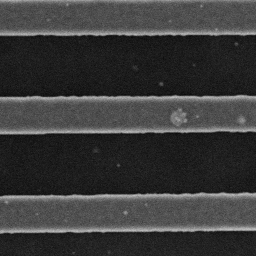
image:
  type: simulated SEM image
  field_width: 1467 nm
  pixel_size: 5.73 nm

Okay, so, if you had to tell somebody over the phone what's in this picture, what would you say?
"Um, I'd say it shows lines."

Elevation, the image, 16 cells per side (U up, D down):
UUUUUUUUUUUUUUUU
UUUUUUUUUUUUUUUU
DDDDDDDDDDDDDDDD
DDDDDDDDDDDDDDDD
DDDDDDDDDDDDDDDD
DDDDDDDDDDDDDDDD
UUUUUUUUUUUUUUUU
UUUUUUUUUUUUUUUU
DDDDDDDDDDDDDDDD
DDDDDDDDDDDDDDDD
DDDDDDDDDDDDDDDD
DDDDDDDDDDDDDDDD
UUUUUUUUUUUUUUUU
UUUUUUUUUUUUUUUU
UUUUUUUDDDDDDDDD
DDDDDDDDDDDDDDDD